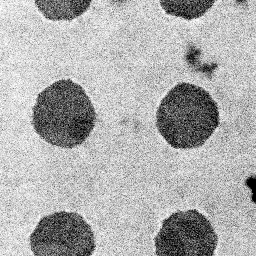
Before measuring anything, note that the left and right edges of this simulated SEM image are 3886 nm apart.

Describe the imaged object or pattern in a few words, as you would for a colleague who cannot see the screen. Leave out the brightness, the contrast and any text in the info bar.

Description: raised bodies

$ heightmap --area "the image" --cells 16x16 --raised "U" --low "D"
DDUUUUDDDDUUUDDD
DDDDDDDDDDDDDDDD
DDDDDDDDDDDDDDDD
DDDDDDDDDDDDDDDD
DDDDDDDDDDDDDDDD
DDDUUDDDDDDUUDDD
DDUUUUDDDDUUUUDD
DDUUUUDDDDUUUUDD
DDUUUUDDDDUUUDDD
DDDDDDDDDDDDDDDD
DDDDDDDDDDDDDDDD
DDDDDDDDDDDDDDDD
DDDDDDDDDDDDDDDD
DDDUUDDDDDDUUDDD
DDUUUUDDDDUUUDDD
DDUUUUDDDDUUUUDD